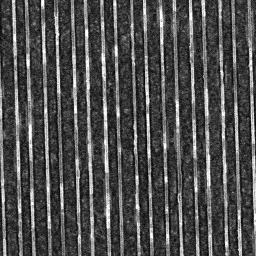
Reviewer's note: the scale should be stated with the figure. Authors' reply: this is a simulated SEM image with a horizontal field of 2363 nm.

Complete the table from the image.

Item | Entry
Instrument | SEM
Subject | parallel lines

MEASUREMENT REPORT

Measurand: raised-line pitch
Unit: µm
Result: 0.136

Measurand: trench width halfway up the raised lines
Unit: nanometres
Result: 116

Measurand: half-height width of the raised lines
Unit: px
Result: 2.75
